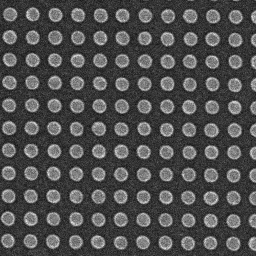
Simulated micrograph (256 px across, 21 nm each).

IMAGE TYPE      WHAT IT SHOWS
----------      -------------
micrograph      a regular array of raised bodies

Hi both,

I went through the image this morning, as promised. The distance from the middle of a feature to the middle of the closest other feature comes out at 468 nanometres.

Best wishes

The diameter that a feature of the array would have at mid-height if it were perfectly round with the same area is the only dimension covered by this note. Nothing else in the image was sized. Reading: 282 nanometers